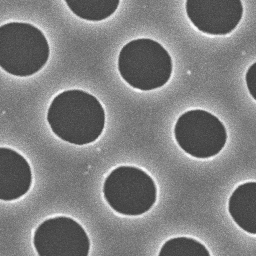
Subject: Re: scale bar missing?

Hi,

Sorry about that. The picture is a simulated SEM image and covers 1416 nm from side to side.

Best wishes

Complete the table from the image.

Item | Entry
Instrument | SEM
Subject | holes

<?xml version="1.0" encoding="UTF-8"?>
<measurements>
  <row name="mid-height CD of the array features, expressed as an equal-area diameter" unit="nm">287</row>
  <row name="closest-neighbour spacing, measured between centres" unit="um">0.484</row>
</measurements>